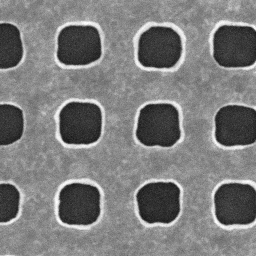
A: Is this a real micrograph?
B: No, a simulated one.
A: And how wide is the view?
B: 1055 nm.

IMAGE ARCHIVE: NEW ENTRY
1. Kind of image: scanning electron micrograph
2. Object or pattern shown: holes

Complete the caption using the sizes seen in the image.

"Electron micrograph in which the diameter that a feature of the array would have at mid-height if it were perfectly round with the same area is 192 nm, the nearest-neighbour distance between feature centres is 321 nm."